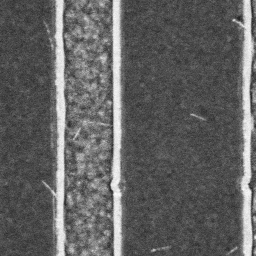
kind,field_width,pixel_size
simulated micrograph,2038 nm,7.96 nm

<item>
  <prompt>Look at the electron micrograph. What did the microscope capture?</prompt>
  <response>one or a few lines or trenches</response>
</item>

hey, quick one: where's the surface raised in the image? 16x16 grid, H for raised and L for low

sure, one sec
HHHHLLLHHHHHHHHL
HHHHLLLHHHHHHHHL
HHHHLLLHHHHHHHHH
HHHHLLLHHHHHHHHL
HHHHLLLHHHHHHHHL
HHHHLLLHHHHHHHHL
HHHHLLLHHHHHHHHL
HHHHLLLHHHHHHHHL
HHHHLLLHHHHHHHHL
HHHHLLLHHHHHHHHL
HHHHLLLHHHHHHHHL
HHHHLLLHHHHHHHHL
HHHHLLLHHHHHHHHL
HHHHLLLHHHHHHHHL
HHHHLLLHHHHHHHHL
HHHHLLLHHHHHHHHL